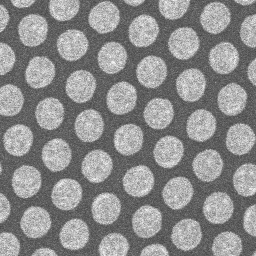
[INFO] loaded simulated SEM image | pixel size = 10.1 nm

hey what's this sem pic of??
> a regular array of raised bodies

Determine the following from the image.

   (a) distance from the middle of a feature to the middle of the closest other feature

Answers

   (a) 40.7 px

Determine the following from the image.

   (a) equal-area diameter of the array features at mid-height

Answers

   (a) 310 nanometers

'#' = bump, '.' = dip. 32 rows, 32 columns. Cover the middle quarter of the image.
.........######...#######.......
..........####....########.....#
..#####...........########...###
.######...........#######...####
.#######...........#####....####
########....#####...###.....####
########...#######..........####
.######....#######...........###
..#####....#######...........###
...##......#######...#####......
...........#######...######.....
......#.....#####...#######.....
....#####....#......#######.....
...######...........#######....#
...#######...........######....#
...#######.....###....####.....#
...#######...######............#
...######....#######...........#
....#####....#######.....###....
.............#######...######...
#............######....#######..
##...........######....#######..
##....#####....#......########..
##...######............######...
#....#######...........######...
#...########.......#....###.....
.....#######....#####...........
.....######....#######..........
......####.....#######......##..
###....##......#######....#####.
####...........#######...#######
####...........#######...#######